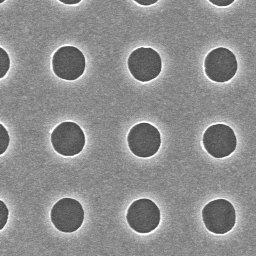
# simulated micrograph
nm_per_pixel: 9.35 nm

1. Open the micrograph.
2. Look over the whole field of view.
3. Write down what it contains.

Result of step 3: a regular array of holes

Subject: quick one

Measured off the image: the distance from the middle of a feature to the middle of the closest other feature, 708 nm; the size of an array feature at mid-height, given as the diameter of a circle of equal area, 0.325 microns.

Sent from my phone